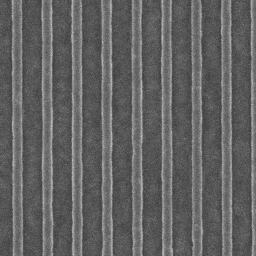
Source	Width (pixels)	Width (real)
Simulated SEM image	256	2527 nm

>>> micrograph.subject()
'parallel lines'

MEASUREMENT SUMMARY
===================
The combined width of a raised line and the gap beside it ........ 295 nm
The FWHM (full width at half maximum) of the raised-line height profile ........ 92.5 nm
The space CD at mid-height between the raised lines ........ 204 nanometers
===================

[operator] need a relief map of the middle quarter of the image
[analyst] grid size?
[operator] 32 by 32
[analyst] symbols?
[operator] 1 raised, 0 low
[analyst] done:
00110000001100000110000011100000
00110000001100000110000011100000
00110000001100000110000011100000
00110000001100000110000011100000
00110000011100000110000001100000
00110000011100000110000001100000
00110000011100000110000001100000
00110000011100000110000001100000
00110000011100000110000001100000
00110000011100000110000001100000
00110000011100000110000001100000
00110000011100000110000001100000
00110000001100000110000001100000
00111000001100000110000001100000
00110000001100000110000001100000
00110000001100000110000001100000
00110000001100000110000001100000
00110000001100000110000001100000
00110000001100000110000001100000
00110000001100000110000001100000
00110000001100000110000001100000
00110000001100000110000001100000
00110000001100000110000001100000
00110000001100000110000001100000
00110000001100000110000001100000
00110000001100000110000001100000
00110000001100000110000001100000
00110000001100000110000001100000
00110000001100000110000001100000
00110000001100000110000001100000
00110000001100000110000001100000
00110000001100000110000001100000